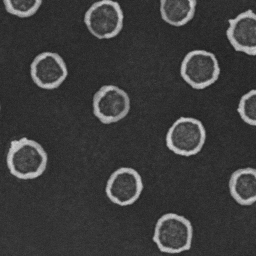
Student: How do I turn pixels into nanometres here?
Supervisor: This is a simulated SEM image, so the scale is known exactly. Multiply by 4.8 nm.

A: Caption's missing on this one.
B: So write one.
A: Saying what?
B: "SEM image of raised bodies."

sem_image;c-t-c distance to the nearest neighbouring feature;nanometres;332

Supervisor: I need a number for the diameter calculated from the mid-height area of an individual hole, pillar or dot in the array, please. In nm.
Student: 182